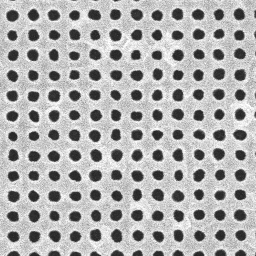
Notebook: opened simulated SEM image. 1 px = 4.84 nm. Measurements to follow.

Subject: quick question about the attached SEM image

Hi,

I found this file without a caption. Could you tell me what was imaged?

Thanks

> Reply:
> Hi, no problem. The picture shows a regular array of holes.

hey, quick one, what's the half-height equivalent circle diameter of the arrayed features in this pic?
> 11.3 px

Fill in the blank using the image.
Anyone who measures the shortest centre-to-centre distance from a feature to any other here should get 95.7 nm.